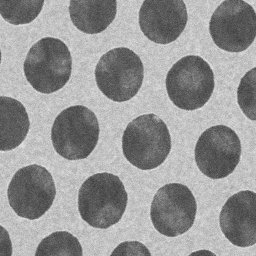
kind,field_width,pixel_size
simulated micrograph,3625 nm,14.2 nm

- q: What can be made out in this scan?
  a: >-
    a regular array of holes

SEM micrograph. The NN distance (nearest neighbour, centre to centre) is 1.02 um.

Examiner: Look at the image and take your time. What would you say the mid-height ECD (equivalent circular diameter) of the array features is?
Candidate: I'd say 0.737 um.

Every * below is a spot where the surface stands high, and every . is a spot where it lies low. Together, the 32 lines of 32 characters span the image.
.....****......***.....****....*
.....****......**......****.....
*...*****.....***......***......
**********...****......***......
******************.....***......
****....************.******....*
***......****....************.**
***......***......****....******
***......***......***.....*****.
***......***......***......***..
****....****......***......***..
*****..******....****......***..
..************..*****.....****..
...*****...***********...*****..
....***.....*****..************.
....***.....****.....***********
....**......***......****....***
...***......***......****.....**
..*****.....***......***......**
********...****......***......**
****************....*****.....**
**....*******************....***
*......****....*****************
*......***......****....********
*......***......***.....*****...
*......***......***......***....
**....****......***......***....
**********.....****.....***.....
.***********..*****.....***.....
.*****...************.******....
..***.....*****...***********...
..**......****.....*****...*****